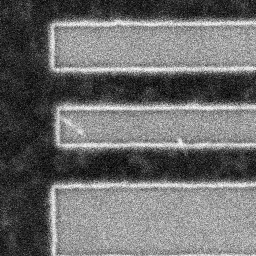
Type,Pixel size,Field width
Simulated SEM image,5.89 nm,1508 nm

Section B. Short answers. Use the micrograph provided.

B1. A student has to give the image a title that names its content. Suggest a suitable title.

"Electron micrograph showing one or a few lines or trenches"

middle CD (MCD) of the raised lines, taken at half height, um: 0.241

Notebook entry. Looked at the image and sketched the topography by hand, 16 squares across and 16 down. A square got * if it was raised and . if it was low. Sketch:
****************
*******..******.
***.............
***.............
****************
****************
****************
****............
****............
****************
****************
****************
***.............
***.............
***.............
***.............